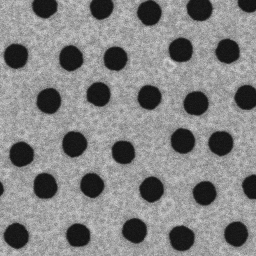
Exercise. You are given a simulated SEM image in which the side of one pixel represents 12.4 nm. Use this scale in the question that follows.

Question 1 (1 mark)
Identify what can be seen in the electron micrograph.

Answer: a regular array of holes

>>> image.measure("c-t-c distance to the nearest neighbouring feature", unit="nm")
560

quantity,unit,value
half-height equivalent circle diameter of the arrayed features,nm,309